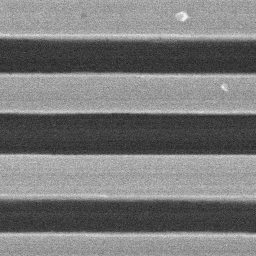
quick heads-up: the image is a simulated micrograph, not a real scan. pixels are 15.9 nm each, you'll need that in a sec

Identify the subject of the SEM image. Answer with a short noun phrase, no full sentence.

lines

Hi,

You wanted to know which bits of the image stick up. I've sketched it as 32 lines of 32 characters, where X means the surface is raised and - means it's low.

XXXXXXXXXXXXXXXXXXXXXXXXXXXXXXXX
XXXXXXXXXXXXXXXXXXXXXXXXXXXXXXXX
XXXXXXXXXXXXXXXXXXXXXXXXXXXXXXXX
XXXXXXXXXXXXXXXXXXXXXXXXXXXXXXXX
-------------XXXXXXXXXXXXXXXXXXX
--------------------------------
--------------------------------
--------------------------------
--------------------------------
XXXXXXXXXXXXXXXXXXXXXXXXXXXXXXXX
XXXXXXXXXXXXXXXXXXXXXXXXXXXXXXXX
XXXXXXXXXXXXXXXXXXXXXXXXXXXXXXXX
XXXXXXXXXXXXXXXXXXXXXXXXXXXXXXXX
XXXXXXXXXXXXXXXXXXXXXXXXXXXXXXXX
--------------------------------
--------------------------------
--------------------------------
--------------------------------
--------------------------------
XXXXXXXXXXXXXXXXXXXXXXXXXXXXXXXX
XXXXXXXXXXXXXXXXXXXXXXXXXXXXXXXX
XXXXXXXXXXXXXXXXXXXXXXXXXXXXXXXX
XXXXXXXXXXXXXXXXXXXXXXXXXXXXXXXX
XXXXXXXXXXXXXXXXXXXXXXXXXXXXXXXX
------XXXXXXXXXXXXXXXXXXXXXXXXXX
--------------------------------
--------------------------------
--------------------------------
--------------------------------
XXXXXXXXXXXXXXXXXXXXXXXXXXXXXXXX
XXXXXXXXXXXXXXXXXXXXXXXXXXXXXXXX
XXXXXXXXXXXXXXXXXXXXXXXXXXXXXXXX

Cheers